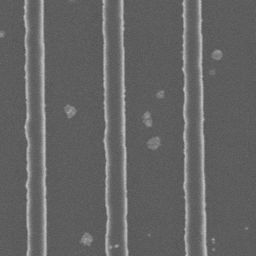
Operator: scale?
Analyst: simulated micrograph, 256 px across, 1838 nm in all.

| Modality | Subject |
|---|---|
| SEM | lines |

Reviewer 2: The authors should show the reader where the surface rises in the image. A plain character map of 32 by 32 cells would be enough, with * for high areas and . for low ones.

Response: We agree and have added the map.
...**........**........**.......
...**........**........**.......
...**........**........**.......
...**........**........**.......
...**........**........**.......
...**........**........**.......
...**........**........**.......
...**........**........**.......
...**........**........**.......
...**........**........**.......
...**........**........**.......
...**........**........**.......
...**........**........**.......
...**........**........**.......
...**........**........**.......
...**........**........**.......
...***.......***.......**.......
...***.......***.......**.......
...***.......***.......**.......
...***.......***.......**.......
...***.......***.......**.......
...***.......***.......**.......
...***.......***.......**.......
...***.......***.......**.......
...***.......***.......***......
...***.......***.......***......
...***.......***.......***......
...***.......***.......***......
...***.......***.......***......
....**.......***.......***......
....**.......***.......***......
...***.......***.......***......